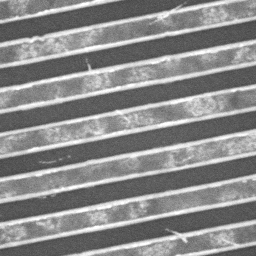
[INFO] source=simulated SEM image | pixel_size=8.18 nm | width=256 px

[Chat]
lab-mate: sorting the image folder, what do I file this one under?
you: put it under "parallel lines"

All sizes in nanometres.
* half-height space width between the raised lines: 177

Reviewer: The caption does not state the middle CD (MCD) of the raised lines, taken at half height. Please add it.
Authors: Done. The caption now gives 185 nm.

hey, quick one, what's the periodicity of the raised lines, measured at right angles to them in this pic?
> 362 nm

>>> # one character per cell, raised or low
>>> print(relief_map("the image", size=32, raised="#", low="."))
############..............######
#######..............###########
#...............###############.
...........###############......
......##############............
###############...............##
##########..............########
#####..............#############
..............###############...
.........###############........
....##############..............
#############...............####
########..............##########
###..............###############
............###############.....
.......###############..........
.################..............#
###########...............######
######...............###########
#..............###############..
..........###############.......
.....###############............
###############..............###
#########...............########
####...............#############
.............################...
........###############.........
...###############..............
#############..............#####
#######...............##########
##...............###############
............###############.....